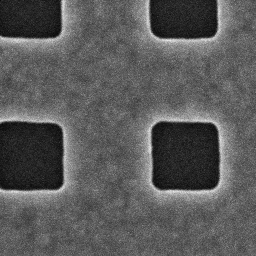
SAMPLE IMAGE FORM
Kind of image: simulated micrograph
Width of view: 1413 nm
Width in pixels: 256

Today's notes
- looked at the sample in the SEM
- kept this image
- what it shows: holes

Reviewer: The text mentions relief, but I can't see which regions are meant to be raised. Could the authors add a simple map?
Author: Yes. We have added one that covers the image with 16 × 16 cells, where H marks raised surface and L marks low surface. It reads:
LLLLHHHHHLLLLLHH
LLLLHHHHHLLLLLHH
HHHHHHHHHHHHHHHH
HHHHHHHHHHHHHHHH
HHHHHHHHHHHHHHHH
HHHHHHHHHHHHHHHH
HHHHHHHHHHHHHHHH
HHHHHHHHHHHHHHHH
LLLLHHHHHLLLLLHH
LLLLHHHHHLLLLLHH
LLLLHHHHHLLLLLHH
LLLLHHHHHHLLLLHH
HHHHHHHHHHHHHHHH
HHHHHHHHHHHHHHHH
HHHHHHHHHHHHHHHH
HHHHHHHHHHHHHHHH